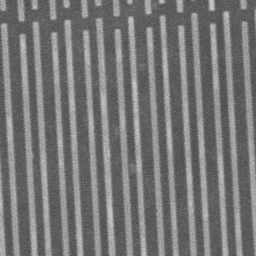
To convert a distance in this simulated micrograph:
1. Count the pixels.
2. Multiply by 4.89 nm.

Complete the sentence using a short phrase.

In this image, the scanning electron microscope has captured parallel lines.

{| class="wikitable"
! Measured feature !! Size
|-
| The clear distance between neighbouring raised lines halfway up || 61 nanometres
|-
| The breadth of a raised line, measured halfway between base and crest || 22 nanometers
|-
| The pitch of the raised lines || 78.1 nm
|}